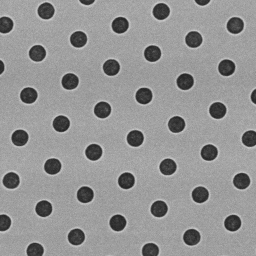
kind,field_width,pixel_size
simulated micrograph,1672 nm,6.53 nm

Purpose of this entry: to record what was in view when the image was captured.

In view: a regular array of holes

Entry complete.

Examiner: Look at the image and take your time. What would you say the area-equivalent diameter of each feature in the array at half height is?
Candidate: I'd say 17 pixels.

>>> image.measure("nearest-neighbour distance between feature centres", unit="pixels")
43